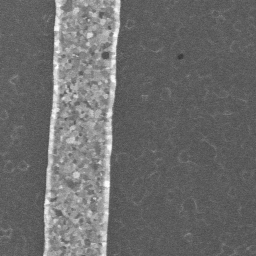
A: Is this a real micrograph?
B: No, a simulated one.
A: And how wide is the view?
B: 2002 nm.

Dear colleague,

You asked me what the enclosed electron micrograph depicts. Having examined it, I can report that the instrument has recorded one or a few lines or trenches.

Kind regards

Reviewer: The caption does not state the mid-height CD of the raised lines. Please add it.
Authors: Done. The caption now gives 459 nanometers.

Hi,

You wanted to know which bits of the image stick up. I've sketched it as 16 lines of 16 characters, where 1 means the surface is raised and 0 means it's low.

0000111000000000
0000111000000000
0000111000000000
0001111000000000
0001111000000000
0001111000000000
0001111000000000
0001111000000000
0001111000000000
0001111000000000
0001111000000000
0001111000000000
0001111000000000
0001111000000000
0001111000000000
0001111000000000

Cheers